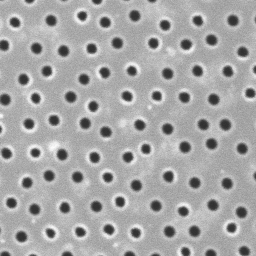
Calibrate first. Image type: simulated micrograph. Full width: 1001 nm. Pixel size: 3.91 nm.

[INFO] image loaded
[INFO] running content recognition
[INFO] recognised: a regular array of holes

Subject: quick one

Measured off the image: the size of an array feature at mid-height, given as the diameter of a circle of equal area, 44.2 nanometres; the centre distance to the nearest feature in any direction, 96.6 nanometres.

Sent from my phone